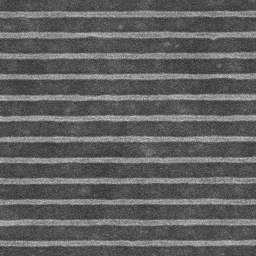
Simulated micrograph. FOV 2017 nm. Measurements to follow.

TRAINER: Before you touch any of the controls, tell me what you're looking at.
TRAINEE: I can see parallel lines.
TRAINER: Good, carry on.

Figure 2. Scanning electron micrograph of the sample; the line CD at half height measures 36.5 nm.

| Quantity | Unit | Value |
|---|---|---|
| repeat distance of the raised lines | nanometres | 164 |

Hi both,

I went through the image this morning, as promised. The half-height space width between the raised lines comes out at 0.128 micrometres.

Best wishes